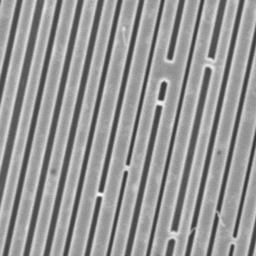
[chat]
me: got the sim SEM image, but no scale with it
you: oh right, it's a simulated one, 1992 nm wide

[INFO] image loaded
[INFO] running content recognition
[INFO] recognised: parallel lines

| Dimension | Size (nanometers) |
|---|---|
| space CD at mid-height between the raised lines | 43.7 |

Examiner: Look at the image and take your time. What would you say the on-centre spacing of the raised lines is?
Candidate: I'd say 155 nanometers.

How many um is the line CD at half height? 0.117